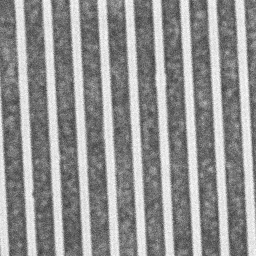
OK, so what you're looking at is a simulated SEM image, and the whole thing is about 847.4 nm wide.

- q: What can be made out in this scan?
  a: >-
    parallel lines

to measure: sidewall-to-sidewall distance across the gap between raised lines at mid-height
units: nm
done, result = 63.6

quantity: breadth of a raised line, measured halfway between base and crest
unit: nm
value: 27.7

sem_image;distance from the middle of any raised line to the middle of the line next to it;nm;91